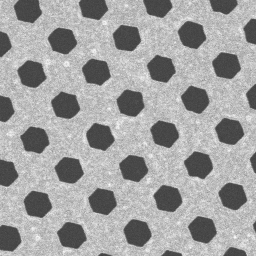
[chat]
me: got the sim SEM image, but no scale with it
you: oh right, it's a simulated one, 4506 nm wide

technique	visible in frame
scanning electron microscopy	a regular array of holes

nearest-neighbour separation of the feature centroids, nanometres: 802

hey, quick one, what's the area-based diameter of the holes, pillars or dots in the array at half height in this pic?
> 0.477 micrometres